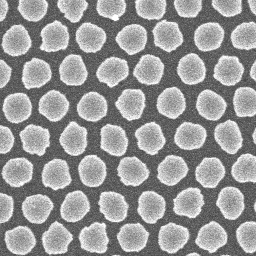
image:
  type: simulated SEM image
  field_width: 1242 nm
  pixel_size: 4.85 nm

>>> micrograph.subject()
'a regular array of raised bodies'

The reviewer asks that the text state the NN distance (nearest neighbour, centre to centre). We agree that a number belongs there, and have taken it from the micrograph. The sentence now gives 178 nanometres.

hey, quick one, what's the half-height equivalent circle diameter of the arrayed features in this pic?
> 0.144 microns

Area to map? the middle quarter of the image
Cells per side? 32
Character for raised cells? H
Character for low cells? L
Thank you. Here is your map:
HHHHHLLLLHHHHHHHLLHHHHHHHLLLHHHH
HHHHHHLLHHHHHHHHLLHHHHHHHLLLHHHH
HHHHHHLLHHHHHHHHLHHHHHHHHLLLHHHH
HHHHHHLLHHHHHHHLLLHHHHHHLLLLLHHH
HHHHHLLLLLHHHHLLLLLHHHHHLLLLLLHH
LLLLLLLLLLLHHLLLLLLLLLLLLLLLLLLL
LLLLLLLLLLLLLLLHHHHLLLLLLHHHHLLL
LLLLLLHHLLLLLLHHHHHHLLLLHHHHHHLL
LLLLLHHHHHLLLLHHHHHHLLLHHHHHHHLL
HLLLHHHHHHLLLHHHHHHHLLLHHHHHHHLL
HLLHHHHHHHHLLHHHHHHHLLLHHHHHHHLL
HLLHHHHHHHHLLLHHHHHHLLLLHHHHHHLL
LLLLHHHHHHLLLLHHHHHLLLLLLHHHHLLL
LLLLHHHHHLLLLLLHHHHLLLLLLLHHLLLL
LLLLLLLLLLLLLLLLLLLLLLHLLLLLLLLL
LHHHLLLLLLHHHLLLLLLLHHHHLLLLLHHH
HHHHHHLLLHHHHHLLLLHHHHHHLLLLHHHH
HHHHHHLLLHHHHHHLLLHHHHHHHLLLHHHH
HHHHHHLLLHHHHHHLLLHHHHHHHLLLHHHH
HHHHHHLLLHHHHHHHLLHHHHHHHLLLHHHH
HHHHHLLLLHHHHHHHLLLHHHHHHLLLLHHH
HHHHHLLLLLHHHHHHLLLHHHHHLLLLLLLL
LHHHLLLLLLLLHHHLLLLLLHHLLLLLLLLL
LLLLLHHHLLLLLLLHHHLLLLLLLHHHHHLL
LLLLHHHHHHLLLLHHHHHLLLLLHHHHHHLL
HLLLHHHHHHLLLLHHHHHHLLLLHHHHHHHL
HLLLHHHHHHLLLHHHHHHHHLLHHHHHHHHL
HLLLHHHHHHLLLHHHHHHHHLLHHHHHHHHL
HHLLHHHHHHLLLLHHHHHHHLLLHHHHHHLL
HHLLLHHHHHLLLLHHHHHHLLLLLHHHHLLL
HLLLLLHHHLLLLLLLLLLLLLLLLLLLLLLL
LLLLLLLLLLLLLLLLLLLLLLLLLLLLLLLH